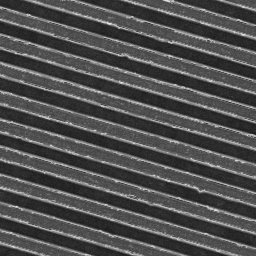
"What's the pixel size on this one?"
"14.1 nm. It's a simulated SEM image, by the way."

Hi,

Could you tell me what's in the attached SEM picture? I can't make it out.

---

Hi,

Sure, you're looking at parallel lines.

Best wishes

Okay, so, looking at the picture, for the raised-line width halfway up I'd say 194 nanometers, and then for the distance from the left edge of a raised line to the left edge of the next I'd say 0.378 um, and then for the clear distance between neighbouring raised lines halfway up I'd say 0.181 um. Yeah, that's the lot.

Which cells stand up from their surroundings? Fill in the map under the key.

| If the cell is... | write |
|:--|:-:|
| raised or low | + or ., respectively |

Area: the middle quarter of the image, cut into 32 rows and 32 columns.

+++++++++++............+++++++++
..+++++++++++++...........++++++
......++++++++++++............++
.........+++++++++++++..........
+............++++++++++++.......
+++++...........+++++++++++++...
++++++++............++++++++++++
+++++++++++............+++++++++
...++++++++++++............+++++
......++++++++++++............++
.........+++++++++++++..........
.............++++++++++++.......
++++............+++++++++++++...
+++++++.............++++++++++++
+++++++++++............+++++++++
...+++++++++++.............+++++
......++++++++++++............++
..........+++++++++++...........
+...........+++++++++++++.......
++++............+++++++++++++...
+++++++............++++++++++++.
+++++++++++............+++++++++
..++++++++++++.............+++++
......++++++++++++............++
..........+++++++++++...........
+............++++++++++++.......
++++.............+++++++++++....
++++++++............++++++++++++
+++++++++++.............++++++++
...++++++++++++............+++++
.......+++++++++++.............+
..........+++++++++++...........